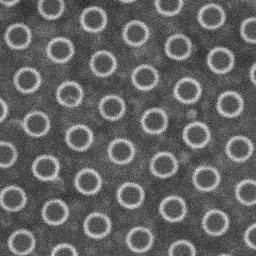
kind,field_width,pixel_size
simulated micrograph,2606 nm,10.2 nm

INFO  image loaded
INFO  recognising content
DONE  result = a regular array of raised bodies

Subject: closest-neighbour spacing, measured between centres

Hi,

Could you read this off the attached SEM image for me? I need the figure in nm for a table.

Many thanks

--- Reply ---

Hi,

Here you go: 452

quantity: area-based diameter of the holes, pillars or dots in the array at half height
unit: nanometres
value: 241